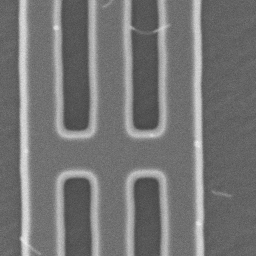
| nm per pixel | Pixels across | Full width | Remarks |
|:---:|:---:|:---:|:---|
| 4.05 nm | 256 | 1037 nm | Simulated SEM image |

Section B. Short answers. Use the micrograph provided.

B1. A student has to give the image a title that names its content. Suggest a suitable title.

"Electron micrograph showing groups of lines, slits or small figures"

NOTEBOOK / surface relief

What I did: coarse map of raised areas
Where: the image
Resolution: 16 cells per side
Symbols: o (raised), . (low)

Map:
.ooo..oo..oo....
.ooo..oo..oo....
.ooo..oo..oo....
.ooo..oo..oo....
.ooo..oo..oo....
.ooo..oo..oo....
.ooo..oo..oo....
.ooo..oo..oo....
.ooooooooooo....
.ooooooooooo....
.ooooooooooo....
..oo..oo..ooo...
..oo..oo..ooo...
..oo..oo..ooo...
..oo..oo..ooo...
..oo..oo..ooo...